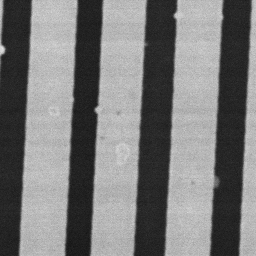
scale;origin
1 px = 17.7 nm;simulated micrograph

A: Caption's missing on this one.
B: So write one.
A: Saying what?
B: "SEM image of lines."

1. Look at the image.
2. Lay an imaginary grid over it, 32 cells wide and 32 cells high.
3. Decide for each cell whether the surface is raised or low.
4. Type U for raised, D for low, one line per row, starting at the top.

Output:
DDDDUUUUUUDDDUUUUUDDDDUUUUUUDDDD
DDDDUUUUUUDDDUUUUUDDDDUUUUUUDDDU
DDDDUUUUUDDDDUUUUUDDDDUUUUUUDDDU
DDDDUUUUUDDDDUUUUUDDDDUUUUUUDDDU
DDDDUUUUUDDDDUUUUUDDDDUUUUUUDDDU
DDDDUUUUUDDDDUUUUUDDDDUUUUUDDDDU
DDDDUUUUUDDDDUUUUUDDDDUUUUUDDDDU
DDDDUUUUUDDDDUUUUUDDDDUUUUUDDDDU
DDDDUUUUUDDDDUUUUUDDDDUUUUUDDDDU
DDDDUUUUUDDDDUUUUUDDDDUUUUUDDDDU
DDDUUUUUUDDDUUUUUUDDDDUUUUUDDDDU
DDDUUUUUUDDDUUUUUUDDDDUUUUUDDDDU
DDDUUUUUUDDDUUUUUUDDDDUUUUUDDDDU
DDDUUUUUUDDDUUUUUUDDDDUUUUUDDDDU
DDDUUUUUUDDDUUUUUDDDDDUUUUUDDDDU
DDDUUUUUUDDDUUUUUDDDDDUUUUUDDDDU
DDDUUUUUUDDDUUUUUDDDDUUUUUUDDDDU
DDDUUUUUUDDDUUUUUDDDDUUUUUUDDDDU
DDDUUUUUUDDDUUUUUDDDDUUUUUUDDDDU
DDDUUUUUUDDDUUUUUDDDDUUUUUUDDDDU
DDDUUUUUUDDDUUUUUDDDDUUUUUUDDDDU
DDDUUUUUUDDDUUUUUDDDDUUUUUUDDDUU
DDDUUUUUUDDDUUUUUDDDDUUUUUUDDDUU
DDDUUUUUUDDDUUUUUDDDDUUUUUUDDDUU
DDDUUUUUDDDDUUUUUDDDDUUUUUUDDDUU
DDDUUUUUDDDDUUUUUDDDDUUUUUDDDDUU
DDDUUUUUDDDDUUUUUDDDDUUUUUDDDDUU
DDDUUUUUDDDDUUUUUDDDDUUUUUDDDDUU
DDDUUUUUDDDDUUUUUDDDDUUUUUDDDDUU
DDDUUUUUDDDUUUUUUDDDDUUUUUDDDDUU
DDDUUUUUDDDUUUUUUDDDDUUUUUDDDDUU
DDUUUUUUDDDUUUUUUDDDDUUUUUDDDDUU